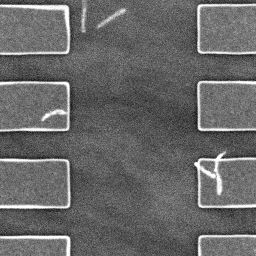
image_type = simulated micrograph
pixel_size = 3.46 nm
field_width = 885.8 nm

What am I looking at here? groups of lines, slits or small figures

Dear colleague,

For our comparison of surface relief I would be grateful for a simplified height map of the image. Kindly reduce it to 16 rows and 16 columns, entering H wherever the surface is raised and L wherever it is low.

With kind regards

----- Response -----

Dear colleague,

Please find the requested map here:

HHHHLLLLLLLLLHHH
HHHHLLLLLLLLHHHH
HHHHLLLLLLLLHHHH
LLLLLLLLLLLLLLLL
LLLLLLLLLLLLLLLL
HHHHLLLLLLLLHHHH
HHHHLLLLLLLLHHHH
HHHHLLLLLLLLHHHH
LLLLLLLLLLLLLLLL
LLLLLLLLLLLLLLLL
HHHHLLLLLLLLHHHH
HHHHLLLLLLLLHHHH
HHHHLLLLLLLLHHHH
LLLLLLLLLLLLLLLL
LLLLLLLLLLLLLLLL
HHHHLLLLLLLLHHHH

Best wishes